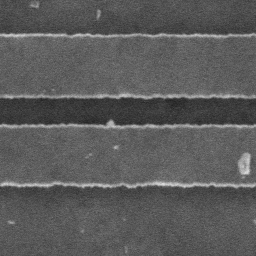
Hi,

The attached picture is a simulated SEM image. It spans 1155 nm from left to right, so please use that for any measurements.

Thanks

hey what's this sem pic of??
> lines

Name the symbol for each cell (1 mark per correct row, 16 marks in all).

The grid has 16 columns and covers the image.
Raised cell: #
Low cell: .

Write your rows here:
................
................
################
################
################
################
................
................
################
################
################
################
................
................
................
................